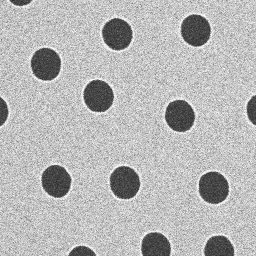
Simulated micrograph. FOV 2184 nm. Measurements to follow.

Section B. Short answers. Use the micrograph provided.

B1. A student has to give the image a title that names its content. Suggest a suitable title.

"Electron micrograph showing a regular array of holes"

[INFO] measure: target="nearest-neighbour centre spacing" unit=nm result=584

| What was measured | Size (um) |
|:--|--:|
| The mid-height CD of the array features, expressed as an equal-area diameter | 0.271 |